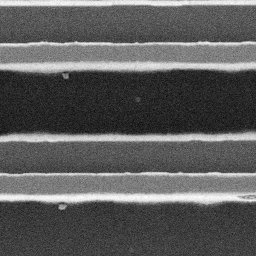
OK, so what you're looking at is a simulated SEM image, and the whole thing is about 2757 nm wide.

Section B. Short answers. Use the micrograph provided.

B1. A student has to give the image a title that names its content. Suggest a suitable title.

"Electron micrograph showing lines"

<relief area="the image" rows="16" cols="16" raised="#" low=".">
################
################
################
################
................
................
................
................
................
################
################
################
...............#
................
................
................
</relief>